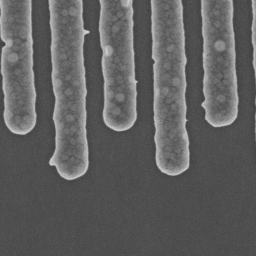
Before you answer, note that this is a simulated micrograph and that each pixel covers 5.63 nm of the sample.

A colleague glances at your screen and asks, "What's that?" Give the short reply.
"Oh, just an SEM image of parallel lines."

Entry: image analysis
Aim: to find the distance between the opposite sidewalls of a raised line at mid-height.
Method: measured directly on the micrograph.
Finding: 179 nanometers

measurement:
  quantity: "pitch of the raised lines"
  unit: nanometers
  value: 283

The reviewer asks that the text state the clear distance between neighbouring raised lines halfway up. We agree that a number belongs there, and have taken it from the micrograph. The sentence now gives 103 nm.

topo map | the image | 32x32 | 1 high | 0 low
11110011110001110001111001111000
11110011110001111001111001111000
11110011110011111001111001111000
11110011111011111001111001111001
11110011111001111001111001111000
01110011110001111001111001111000
11110011110001111001111001111000
11110011110001111001111001111000
11110001111001111001111001111000
11110001111001111001111001111100
11110001111001111001111001111100
11110001111001111001111001111100
01110001111001111001111000111100
01110001111001111001111000111100
11111001111001111001111000111100
01110001111001111001111000111000
00110001111000000001111000000000
00000001111000000001111100000000
00000001111000000000111100000000
00000001111000000001111100000000
00000011111000000000111100000000
00000001111000000000111000000000
00000000000000000000000000000000
00000000000000000000000000000000
00000000000000000000000000000000
00000000000000000000000000000000
00000000000000000000000000000000
00000000000000000000000000000000
00000000000000000000000000000000
00000000000000000000000000000000
00000000000000000000000000000000
00000000000000000000000000000000